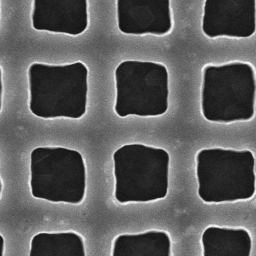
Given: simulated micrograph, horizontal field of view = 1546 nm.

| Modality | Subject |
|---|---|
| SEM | holes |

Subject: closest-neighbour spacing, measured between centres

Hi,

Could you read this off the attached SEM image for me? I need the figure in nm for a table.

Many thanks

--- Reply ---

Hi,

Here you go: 503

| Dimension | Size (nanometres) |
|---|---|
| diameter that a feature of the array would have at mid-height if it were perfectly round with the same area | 359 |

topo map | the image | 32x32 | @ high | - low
@@@@-------@@@@------@@@@@------
@@@@-------@@@@------@@@@@------
@@@@-------@@@@------@@@@-------
@@@@-------@@@@------@@@@-------
@@@@@@@@@@@@@@@@@@@@@@@@@@-@@--@
@@@@@@@@@@@@@@@@@@@@@@@@@@@@@@@@
@@@@@@@@@@@@@@@@@@@@@@@@@@@@@@@@
@@@@@@@@@@@@@@@@@@@@@@@@@@@@@@@@
@@@@-------@@@@------@@@@@-----@
@@@@-------@@@-------@@@@@------
@@@@-------@@@@------@@@@-------
@@@@-------@@@@------@@@@-------
@@@@-------@@@@------@@@@-------
@@@@-------@@@-------@@@@-------
@@@@@-----@@@@@-@@@@@@@@@@-----@
@@@@@@@@@@@@@@@@@@@@@@@@@@@@@@@@
@@@@@@@@@@@@@@@@@@@@@@@@@@@@@@@@
@@@@@@@@@@@@@@@@@@@@@@@@@@@@@@@@
@@@@@---@@@@@@@-----@@@@@@@@@@@@
@@@@------@@@@-------@@@@-------
@@@@------@@@@-------@@@@-------
@@@@-------@@@-------@@@@-------
@@@@-------@@@-------@@@@-------
@@@@-------@@@-------@@@@-------
@@@@------@@@@-------@@@@------@
@@@@@@@@@@@@@@@@@@@@@@@@@@@@@@@@
@@@@@@@@@@@@@@@@@@@@@@@@@@@@@@@@
@@@@@@@@@@@@@@@@@@@@@@@@@@@@@@@@
@@@@@@@@@@@@@@@@@@@@@@@@@@--@@@@
@@@@------@@@@@------@@@@------@
@@@@------@@@@-------@@@@------@
@@@@-------@@@-------@@@@------@